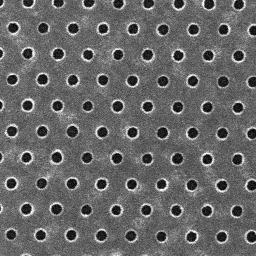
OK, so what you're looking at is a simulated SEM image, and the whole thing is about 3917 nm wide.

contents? a regular array of holes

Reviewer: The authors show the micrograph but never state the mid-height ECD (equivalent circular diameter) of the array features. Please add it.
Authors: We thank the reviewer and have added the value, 166 nm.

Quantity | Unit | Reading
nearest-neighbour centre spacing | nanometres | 453